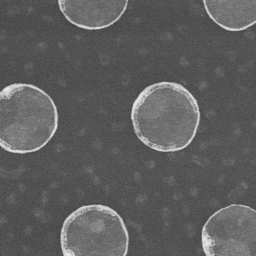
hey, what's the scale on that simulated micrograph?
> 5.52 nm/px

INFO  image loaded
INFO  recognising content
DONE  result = raised bodies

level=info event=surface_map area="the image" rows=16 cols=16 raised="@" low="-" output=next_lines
----@@@@-----@@@
-----@@-------@@
----------------
----------------
----------------
-@-------@@-----
@@@-----@@@@----
@@@@----@@@@----
@@@------@@@----
----------------
----------------
----------------
----------------
----@@@------@@@
----@@@@-----@@@
----@@@@-----@@@